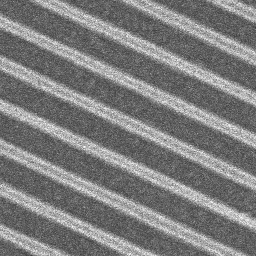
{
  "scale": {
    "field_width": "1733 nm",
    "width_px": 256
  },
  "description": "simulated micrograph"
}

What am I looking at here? parallel lines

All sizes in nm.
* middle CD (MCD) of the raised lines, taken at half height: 76.5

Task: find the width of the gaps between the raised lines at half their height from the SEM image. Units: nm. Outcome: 177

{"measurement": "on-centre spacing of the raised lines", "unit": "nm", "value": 256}